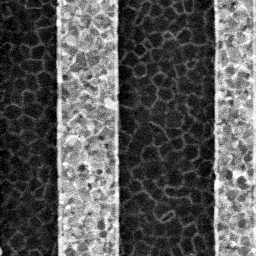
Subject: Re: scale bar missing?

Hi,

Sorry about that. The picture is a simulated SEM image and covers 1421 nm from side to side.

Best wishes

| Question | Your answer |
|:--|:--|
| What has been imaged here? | one or a few lines or trenches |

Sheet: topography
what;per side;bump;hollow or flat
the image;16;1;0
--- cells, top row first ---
0000111000000011
0000111000000011
0000111000000011
0000111000000011
0000111000000011
0000111000000011
0000111000000011
0000111000000011
0000111000000111
0000111000000011
0000111000000011
0000111000000011
0000111000000011
0000111000000011
0000111000000011
0000111000000011